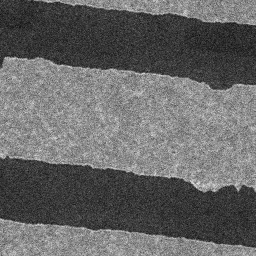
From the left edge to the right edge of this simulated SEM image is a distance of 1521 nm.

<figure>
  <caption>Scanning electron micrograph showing one or a few lines or trenches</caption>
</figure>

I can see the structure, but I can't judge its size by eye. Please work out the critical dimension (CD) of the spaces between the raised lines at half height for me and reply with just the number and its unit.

365 nm